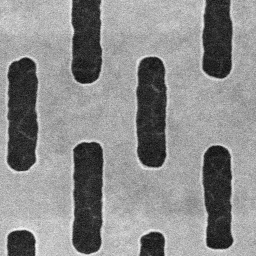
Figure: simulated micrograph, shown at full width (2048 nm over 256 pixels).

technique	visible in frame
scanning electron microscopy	holes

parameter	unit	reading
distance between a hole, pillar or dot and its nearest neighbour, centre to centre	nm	848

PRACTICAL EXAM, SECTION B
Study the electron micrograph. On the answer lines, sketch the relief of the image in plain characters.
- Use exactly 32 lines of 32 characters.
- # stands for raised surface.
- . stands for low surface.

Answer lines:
#########....#############...###
#########....#############...###
#########....############....###
#########....############....###
#########....############....###
#########....############....###
#########....############....###
##..#####....#####..#####....###
#....####....####....####....###
#....####...#####....#####..####
#....#####.######....###########
#....############....###########
#....############....###########
#....############....###########
#....############....###########
#....############....###########
#....############....###########
#....############....###########
#...#####....####....#####..####
#...#####....####....####....###
#...#####....#####..#####....###
##.######....############....###
#########....############....###
#########....############....###
#########....############....###
#########....#############...###
#########....#############...###
#########....#############...###
#########....#############...###
#...#####....#####..######...###
#...#####....####....#####...###
#...######..#####....###########